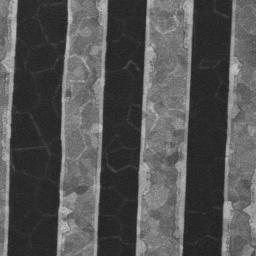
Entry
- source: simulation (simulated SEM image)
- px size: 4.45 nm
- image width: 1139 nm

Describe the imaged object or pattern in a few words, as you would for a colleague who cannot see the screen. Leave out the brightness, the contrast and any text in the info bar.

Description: one or a few lines or trenches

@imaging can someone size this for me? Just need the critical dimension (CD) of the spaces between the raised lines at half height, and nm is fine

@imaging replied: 190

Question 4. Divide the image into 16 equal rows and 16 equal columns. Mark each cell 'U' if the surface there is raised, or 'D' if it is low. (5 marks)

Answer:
UDDDUUUDDUUUDDDU
UDDDUUUDDUUUDDDU
UDDDUUDDDUUUDDDU
UDDDUUDDDUUUDDDU
UDDDUUDDDUUUDDUU
UDDDUUDDDUUUDDUU
UDDDUUDDDUUUDDUU
UDDDUUDDDUUUDDUU
UDDDUUDDDUUUDDUU
DDDDUUDDDUUUDDUU
DDDDUUDDDUUUDDUU
DDDDUUDDDUUDDDUU
DDDDUUDDDUUDDDUU
DDDDUUDDDUUDDDUU
DDDDUUDDDUUDDDUU
DDDDUUDDDUUDDDUU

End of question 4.